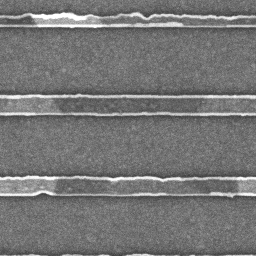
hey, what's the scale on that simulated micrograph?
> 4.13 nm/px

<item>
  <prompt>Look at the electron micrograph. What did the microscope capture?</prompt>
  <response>one or a few lines or trenches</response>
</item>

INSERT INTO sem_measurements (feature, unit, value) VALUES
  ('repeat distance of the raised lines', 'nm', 341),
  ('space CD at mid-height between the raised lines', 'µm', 0.26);